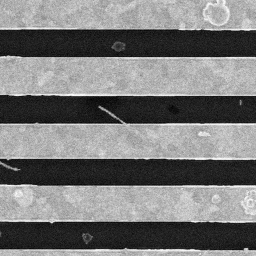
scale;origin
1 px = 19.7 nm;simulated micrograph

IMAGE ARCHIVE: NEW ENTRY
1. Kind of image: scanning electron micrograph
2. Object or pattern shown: lines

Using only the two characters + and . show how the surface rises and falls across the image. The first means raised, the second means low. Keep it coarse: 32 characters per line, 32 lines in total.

++++++++++++++++++++++++++++++++
++++++++++++++++++++++++++++++++
++++++++++++++++++++++++++++++++
++++++++++++++++++++++++++++++++
................................
................................
................................
++++++++++++++++++++++++++++++++
++++++++++++++++++++++++++++++++
++++++++++++++++++++++++++++++++
++++++++++++++++++++++++++++++++
++++++++++++++++++++++++++++++++
................................
................................
................................
....+..........+................
++++++++++++++++++++++++++++++++
++++++++++++++++++++++++++++++++
++++++++++++++++++++++++++++++++
++++++++++++++++++++++++++++++++
................................
................................
................................
++++++++++++++++++++++++++++++++
++++++++++++++++++++++++++++++++
++++++++++++++++++++++++++++++++
++++++++++++++++++++++++++++++++
++++++++++++++++++++++++++++++++
................................
................................
................................
++++++++++++++++++++++++++++++++